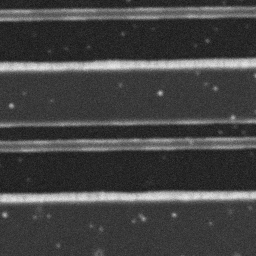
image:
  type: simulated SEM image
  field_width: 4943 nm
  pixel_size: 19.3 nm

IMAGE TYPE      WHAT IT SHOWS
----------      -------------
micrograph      lines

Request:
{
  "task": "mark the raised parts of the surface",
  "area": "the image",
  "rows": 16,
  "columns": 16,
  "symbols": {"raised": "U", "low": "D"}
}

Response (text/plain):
UUUUUUUUUUUUUUUU
DDDDDDDDDDDDDDDD
DDDDDDDDDDDDDDDD
DDDDDDDDDDDDDDDD
UUUUUUUUUUUUUUUU
UUUUUUUUUUUUUUUU
UUUUUUUUUUUUUUUU
UUUUUUUUUUUUUUUU
UUUUUUUUUUUUUUUU
DDDDDDDDDDDDDDDD
DDDDDDDDDDDDDDDD
DDDDDDDDDDDDDDDD
UUUUUUUUUUUUUUUU
UUUUUUUUUUUUUUUU
UUUUUUUUUUUUUUUU
UUUUUUUUUUUUUUUU